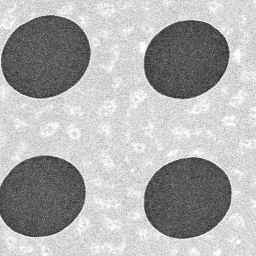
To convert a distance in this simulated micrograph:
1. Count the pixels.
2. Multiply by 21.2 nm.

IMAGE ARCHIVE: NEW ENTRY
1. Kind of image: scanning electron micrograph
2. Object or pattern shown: holes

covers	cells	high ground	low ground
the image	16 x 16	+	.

++++++++++++++++
+....++++++..+++
.....++++.....++
......+++.....++
.....++++.....++
+...++++++...+++
++++++++++++++++
++++++++++++++++
++++++++++++++++
++++++++++++++++
+....+++++....++
.....++++.....++
.....++++.....++
.....++++.....++
+...++++++...+++
++++++++++++++++